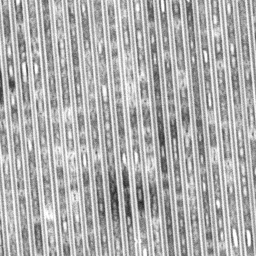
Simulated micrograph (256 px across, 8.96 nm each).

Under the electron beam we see parallel lines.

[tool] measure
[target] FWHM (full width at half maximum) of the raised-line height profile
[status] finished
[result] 41.3 nanometers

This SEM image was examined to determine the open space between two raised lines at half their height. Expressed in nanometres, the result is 74.7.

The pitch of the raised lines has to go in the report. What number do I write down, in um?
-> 0.117